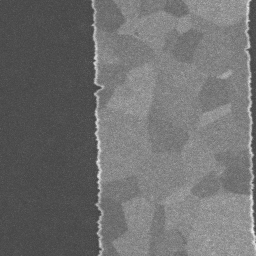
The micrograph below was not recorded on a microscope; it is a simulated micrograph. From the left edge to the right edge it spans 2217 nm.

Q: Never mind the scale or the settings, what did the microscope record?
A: one or a few lines or trenches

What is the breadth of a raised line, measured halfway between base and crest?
1330 nm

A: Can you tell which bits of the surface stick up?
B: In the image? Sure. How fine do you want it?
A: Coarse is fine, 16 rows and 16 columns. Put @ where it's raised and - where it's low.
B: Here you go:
------@@@@@@@@@@
------@@@@@@@@@-
------@@@@@@@@@@
------@@@@@@@@@@
------@@@@@@@@@@
------@@@@@@@@@@
------@@@@@@@@@@
------@@@@@@@@@@
------@@@@@@@@@@
------@@@@@@@@@@
------@@@@@@@@@@
------@@@@@@@@@@
------@@@@@@@@@@
------@@@@@@@@@@
------@@@@@@@@@@
------@@@@@@@@@@